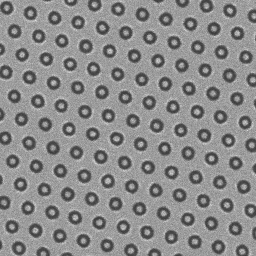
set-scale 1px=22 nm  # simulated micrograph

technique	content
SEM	a regular array of ring-shaped grooves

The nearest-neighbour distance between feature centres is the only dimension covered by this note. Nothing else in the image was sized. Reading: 0.529 micrometres